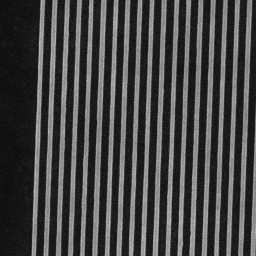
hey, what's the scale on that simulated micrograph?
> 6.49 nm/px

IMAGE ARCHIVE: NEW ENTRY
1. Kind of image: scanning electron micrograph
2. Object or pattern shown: parallel lines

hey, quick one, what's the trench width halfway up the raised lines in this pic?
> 0.0494 micrometres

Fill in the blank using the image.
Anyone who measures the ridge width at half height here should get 27.6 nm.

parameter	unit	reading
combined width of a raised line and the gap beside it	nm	78.9